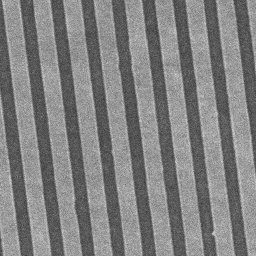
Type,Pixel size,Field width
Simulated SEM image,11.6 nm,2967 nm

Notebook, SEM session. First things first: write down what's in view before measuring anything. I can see parallel lines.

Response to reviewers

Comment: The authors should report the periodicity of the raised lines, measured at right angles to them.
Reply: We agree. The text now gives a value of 352 nanometers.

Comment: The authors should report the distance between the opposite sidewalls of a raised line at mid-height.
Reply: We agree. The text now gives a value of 0.188 µm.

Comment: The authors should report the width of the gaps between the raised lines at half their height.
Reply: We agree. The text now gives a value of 13.4 pixels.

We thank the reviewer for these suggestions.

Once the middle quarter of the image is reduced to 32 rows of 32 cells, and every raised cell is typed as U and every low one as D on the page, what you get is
DDUUUUDDDDUUUDDDDUUUUDDDDUUUUDDD
DDUUUUDDDDUUUUDDDUUUUUDDDUUUUDDD
DDUUUUDDDDUUUUDDDDUUUUDDDUUUUDDD
DDDUUUDDDDUUUUDDDDUUUUDDDUUUUDDD
DDDUUUUDDDUUUUDDDDUUUUDDDUUUUUDD
DDDUUUUDDDUUUUDDDDUUUUDDDDUUUUDD
DDDUUUUDDDUUUUDDDDUUUUDDDDUUUUDD
DDDUUUUDDDUUUUUDDDUUUUDDDDUUUUDD
DDDUUUUDDDDUUUUDDDUUUUDDDDUUUUDD
DDDUUUUDDDDUUUUDDDUUUUUDDDUUUUDD
DDDUUUUDDDDUUUUDDDUUUUUDDDUUUUDD
DDDUUUUDDDDUUUUDDDDUUUUDDDUUUUDD
DDDDUUUUDDDUUUUDDDDUUUUDDDUUUUUD
DDDDUUUUDDDUUUUDDDDUUUUDDDDUUUUD
DDDDUUUUDDDUUUUDDDDUUUUDDDDUUUUD
DDDDUUUUDDDUUUUUDDDUUUUDDDDUUUUD
DDDDUUUUDDDDUUUUDDDUUUUDDDDUUUUD
UDDDUUUUDDDDUUUUDDDUUUUDDDDUUUUD
UDDDUUUUDDDDUUUUDDDUUUUDDDDUUUUD
UDDDDUUUDDDDUUUUDDDDUUUUDDDUUUUD
UDDDDUUUUDDDUUUUDDDDUUUUDDDUUUUU
UDDDDUUUUDDDUUUUDDDDUUUUDDDDUUUU
UDDDDUUUUDDDUUUUDDDDUUUUDDDDUUUU
UDDDDUUUUDDDUUUUUDDDUUUUDDDDUUUU
UDDDDUUUUDDDDUUUUDDDUUUUDDDDUUUU
UUDDDUUUUDDDDUUUUDDDUUUUUDDDUUUU
UUDDDUUUUDDDDUUUUDDDUUUUDDDDUUUU
UUDDDDUUUDDDDUUUUDDDDUUUUDDDUUUU
UUDDDDUUUUDDDUUUUDDDDUUUUDDDUUUU
UUDDDDUUUUDDDUUUUDDDDUUUUDDDDUUU
UUDDDDUUUUDDDUUUUDDDDUUUUDDDDUUU
UUDDDDUUUUDDDUUUUDDDDUUUUDDDDUUU